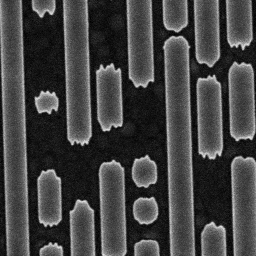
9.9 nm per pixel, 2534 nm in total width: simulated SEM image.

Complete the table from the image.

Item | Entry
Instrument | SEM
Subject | parallel lines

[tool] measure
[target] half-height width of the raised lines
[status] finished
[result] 234 nanometers